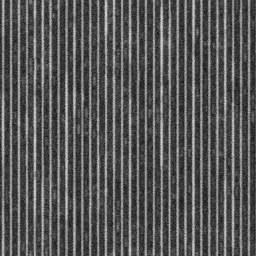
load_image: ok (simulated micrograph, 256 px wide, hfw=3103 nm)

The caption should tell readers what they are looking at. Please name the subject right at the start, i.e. parallel lines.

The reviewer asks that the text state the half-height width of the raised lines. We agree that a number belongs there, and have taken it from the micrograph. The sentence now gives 18.2 nm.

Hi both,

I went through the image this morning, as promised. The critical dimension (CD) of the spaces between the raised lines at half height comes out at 77.3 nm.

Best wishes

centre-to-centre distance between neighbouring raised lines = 96 nm